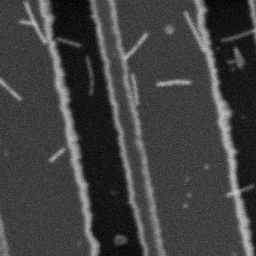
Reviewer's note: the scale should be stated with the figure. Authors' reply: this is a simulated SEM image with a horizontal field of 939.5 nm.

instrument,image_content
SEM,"lines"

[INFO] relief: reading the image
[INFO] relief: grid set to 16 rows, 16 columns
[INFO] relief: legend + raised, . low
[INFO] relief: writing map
+++...+++++++...
+++...+++++++...
+++...+++++++...
+++....++++++...
++++...++++++...
++++...++++++...
++++...+++++++..
++++...+++++++..
++++....++++++..
+++++...++++++..
+++++...+++++++.
+++++...+++++++.
+++++...+++++++.
+++++....++++++.
++++++...++++++.
++++++...+++++++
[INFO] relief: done